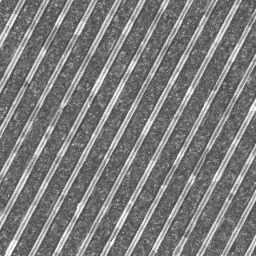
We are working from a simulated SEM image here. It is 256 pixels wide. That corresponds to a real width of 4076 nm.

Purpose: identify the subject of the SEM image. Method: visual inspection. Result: parallel lines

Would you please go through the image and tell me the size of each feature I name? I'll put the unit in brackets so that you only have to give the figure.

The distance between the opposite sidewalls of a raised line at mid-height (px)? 2.98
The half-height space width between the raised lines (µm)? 0.286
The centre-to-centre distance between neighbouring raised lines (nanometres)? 338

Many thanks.